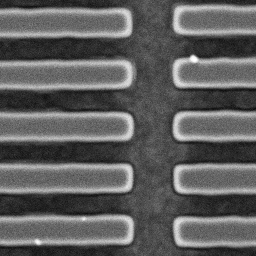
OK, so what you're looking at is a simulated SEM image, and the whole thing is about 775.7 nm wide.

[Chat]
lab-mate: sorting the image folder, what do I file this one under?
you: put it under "groups of lines, slits or small figures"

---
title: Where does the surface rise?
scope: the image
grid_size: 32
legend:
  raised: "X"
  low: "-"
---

--------------------------------
XXXXXXXXXXXXXXXX------XXXXXXXXXX
XXXXXXXXXXXXXXXX------XXXXXXXXXX
XXXXXXXXXXXXXXXX------XXXXXXXXXX
------X--XX---------------------
--------------------------------
--------------------------------
-----------------------XX-XXXXXX
XXXXXXXXXXXXXXXX------XXXXXXXXXX
XXXXXXXXXXXXXXXX------XXXXXXXXXX
XXXXXXXXXXXXXXXX------XXXXXXXXXX
--------------------------------
--------------------------------
--------------------------------
XXXXXXXXXXXXXXXX------XXXXXXXXXX
XXXXXXXXXXXXXXXX------XXXXXXXXXX
XXXXXXXXXXXXXXXX------XXXXXXXXXX
--------------------------------
--------------------------------
--------------------------------
--------------------------------
XXXXXXXXXXXXXXXX------XXXXXXXXXX
XXXXXXXXXXXXXXXX------XXXXXXXXXX
XXXXXXXXXXXXXXXX------XXXXXXXXXX
--------------------------------
--------------------------------
--------------------------------
XXXXXXXXXXXXXXXX------XXXXXXXXXX
XXXXXXXXXXXXXXXX------XXXXXXXXXX
XXXXXXXXXXXXXXXX------XXXXXXXXXX
-X--X------------------XXXXXXXXX
--------------------------------